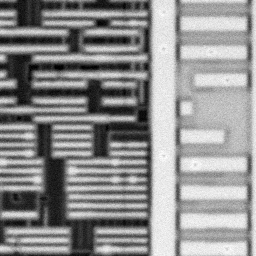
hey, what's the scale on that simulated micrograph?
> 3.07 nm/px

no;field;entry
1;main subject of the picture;wiring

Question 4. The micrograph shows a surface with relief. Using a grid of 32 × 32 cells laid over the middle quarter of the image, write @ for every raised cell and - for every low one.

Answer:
---------------------@@@@@@@@---
---------------------@@@@@@@@---
@@@@@---@@@@@@@@@@@@@@@@@@@@@---
@@@@@---@@@@@@@@@@@@@@@@@@@@@---
@@@@@@---@@@@@@@@@---@@@@@@@@---
@@@@@@---@@@@@@@@@---@@@@@@@@---
---------------------@@@@@@@@---
---------------------@@@@@@@@---
@@@@@@---@@@@@@@@@---@@@@@@@@---
@@@@@@---@@@@@@@@@---@@@@@@@@@@@
@@@@@@----@@@@@@@@---@@@@@@@@@@@
@@@@@@---------------@@@@@@@@@@@
@@@@@@@@@@@----------@@@@@@@@@@@
@@@@@@@@@@@----------@@@@@@@@@@@
@@@@@@@@@@@----------@@@@@@@@---
@@@@@@@--------------@@@@@@@@---
@@@@@@@--------------@@@@@@@@@@@
@@@@@@@----@@@@@@@@@@@@@@@@@@@@@
@@@@@@@----@@@@@@@@@@@@@@@@@@@@@
@@@@@@@----@@@@@@@@@@@@@@@@@@@@@
@@@@@@@----@@@@@@@@@@@@@@@@@@@@@
@@@@@@@----@@@@@@@@@@@@@@@@@@---
@@@@@@@----@@@@@@@@@@@@@@@@@@---
@@@@@@@@@@@@@@@@@@@@@@@@@@@@@@@@
@@@@@@@@@@@@@@@@@@@@@@@@@@@@@@@@
@@@@@@@@@@@@@@@@@@@@@@@@@@@@@@@@
@@@@@@@@@@@@@@@@@@@@@@@@@@@@@@@@
@@@@@@@@@@@@@@@@@@@@@@@@@@@@@@@@
@@@@@@@@@@@@@@@@@@@@@@@@@@@@@---
@@@@@@@@@@@@@@@@@@@@@@@@@@@@@---
@@@@@@@@@@@@@@@@@@@@@@@@@@@@@@@@
@@@@@@@@@@@@@@@@@@@@@@@@@@@@@@@@